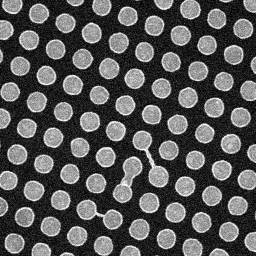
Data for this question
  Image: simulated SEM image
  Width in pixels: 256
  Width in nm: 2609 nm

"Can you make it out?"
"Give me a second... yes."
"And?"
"a regular array of raised bodies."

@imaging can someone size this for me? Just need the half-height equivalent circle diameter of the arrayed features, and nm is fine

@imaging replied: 192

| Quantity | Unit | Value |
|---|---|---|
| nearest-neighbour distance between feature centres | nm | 283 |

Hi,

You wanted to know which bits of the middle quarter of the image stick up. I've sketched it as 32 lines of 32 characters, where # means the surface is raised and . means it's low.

...###...#####...........####...
.........#####...##.......##...#
.........####...####...........#
.###.......#...#####............
####...........#####...###......
#####...........###...#####.....
####...###............#####...##
..#....####............###...###
.......####...###............###
.......###...####............###
#............#####............##
##...........####...####........
##...###......##....####........
#...#####...........####...###..
....#####...#........###..#####.
....#####..####...........#####.
.....##....####............###..
...........####...###...........
...........###...#####..........
..####...........#####...##.....
..####............###...####....
..####...###........#...####....
..####..#####...........####...#
........#####....#...#...###...#
.........###...####..#.........#
###.......#....####...#........#
###............####...###.......
####...........###...#####......
####..####.....##....#####...##.
###...####....###.....####..####
......####...####......##...####
......####...####...........####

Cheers